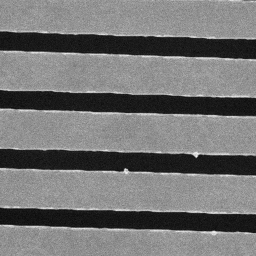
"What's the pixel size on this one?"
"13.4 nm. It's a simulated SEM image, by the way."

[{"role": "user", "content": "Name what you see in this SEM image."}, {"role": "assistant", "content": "lines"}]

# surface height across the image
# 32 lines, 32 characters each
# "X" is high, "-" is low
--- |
XXXXXXXXXXXXXXXXXXXXXXXXXXXXXXXX
XXXXXXXXXXXXXXXXXXXXXXXXXXXXXXXX
XXXXXXXXXXXXXXXXXXXXXXXXXXXXXXXX
XXXXXXXXXXXXXXXXXXXXXXXXXXXXXXXX
------------------XXXXXXXXXXXXXX
--------------------------------
XXX-----------------------------
XXXXXXXXXXXXXXXXXXXXXXXXXXXXXXXX
XXXXXXXXXXXXXXXXXXXXXXXXXXXXXXXX
XXXXXXXXXXXXXXXXXXXXXXXXXXXXXXXX
XXXXXXXXXXXXXXXXXXXXXXXXXXXXXXXX
--------XXXXXXXXXXXXXXXXXXXXXXXX
--------------------------------
--------------------------------
XXXXXXXXXXXXXXXXXXXXXXXXXXXX----
XXXXXXXXXXXXXXXXXXXXXXXXXXXXXXXX
XXXXXXXXXXXXXXXXXXXXXXXXXXXXXXXX
XXXXXXXXXXXXXXXXXXXXXXXXXXXXXXXX
XXXXXXXXXXXXXXXXXXXXXXXXXXXXXXXX
--------------------------------
--------------------------------
XXXXXXXXXXXXXXXXX---------------
XXXXXXXXXXXXXXXXXXXXXXXXXXXXXXXX
XXXXXXXXXXXXXXXXXXXXXXXXXXXXXXXX
XXXXXXXXXXXXXXXXXXXXXXXXXXXXXXXX
XXXXXXXXXXXXXXXXXXXXXXXXXXXXXXXX
-----------------------XXXXXXXXX
--------------------------------
XXXXXXXXX-----------------------
XXXXXXXXXXXXXXXXXXXXXXXXXXXXXXXX
XXXXXXXXXXXXXXXXXXXXXXXXXXXXXXXX
XXXXXXXXXXXXXXXXXXXXXXXXXXXXXXXX